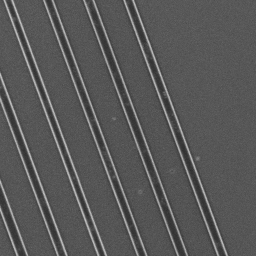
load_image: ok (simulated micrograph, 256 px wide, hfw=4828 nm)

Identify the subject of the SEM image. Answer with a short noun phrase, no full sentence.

parallel lines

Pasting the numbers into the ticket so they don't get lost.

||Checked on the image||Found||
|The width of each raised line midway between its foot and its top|168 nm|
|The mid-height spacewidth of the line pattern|0.555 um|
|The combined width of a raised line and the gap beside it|37.6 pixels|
